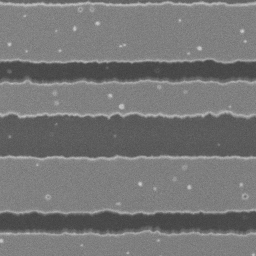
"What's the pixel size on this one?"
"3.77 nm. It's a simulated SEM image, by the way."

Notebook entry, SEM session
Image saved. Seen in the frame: lines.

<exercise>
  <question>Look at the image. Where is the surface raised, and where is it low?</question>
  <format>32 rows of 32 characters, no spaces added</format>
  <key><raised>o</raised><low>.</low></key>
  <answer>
oo..o....ooooo...ooooooooooo...o
oooooooooooooooooooooooooooooooo
oooooooooooooooooooooooooooooooo
oooooooooooooooooooooooooooooooo
oooooooooooooooooooooooooooooooo
oooooooooooooooooooooooooooooooo
oooooooooooooooooooooooooooooooo
ooooooooooooooooooooooooo..ooooo
................................
................................
oooooooooooooooooooooooooooooooo
oooooooooooooooooooooooooooooooo
oooooooooooooooooooooooooooooooo
oooooooooooooooooooooooooooooooo
..oo.........o.......oo.......o.
................................
................................
................................
................................
................................
oooooooooooooooooooooooooooooooo
oooooooooooooooooooooooooooooooo
oooooooooooooooooooooooooooooooo
oooooooooooooooooooooooooooooooo
oooooooooooooooooooooooooooooooo
oooooooooooooooooooooooooooooooo
.ooo.ooooooo..oooooooooooooo....
................................
................................
oooooooooooooooooooooooooooooooo
oooooooooooooooooooooooooooooooo
oooooooooooooooooooooooooooooooo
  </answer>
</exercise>